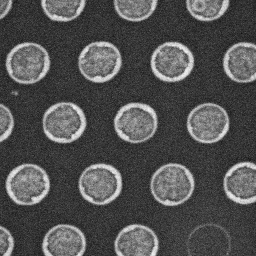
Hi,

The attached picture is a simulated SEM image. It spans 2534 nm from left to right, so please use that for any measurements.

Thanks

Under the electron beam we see a regular array of raised bodies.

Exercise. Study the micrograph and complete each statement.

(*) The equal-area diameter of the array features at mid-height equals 400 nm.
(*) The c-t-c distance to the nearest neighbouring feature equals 701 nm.